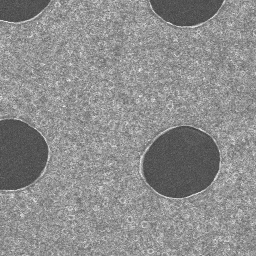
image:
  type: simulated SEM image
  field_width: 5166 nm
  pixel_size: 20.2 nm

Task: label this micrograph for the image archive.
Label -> holes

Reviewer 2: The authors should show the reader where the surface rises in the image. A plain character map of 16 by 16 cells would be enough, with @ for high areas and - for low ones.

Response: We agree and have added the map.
---@@@@@@@----@@
@@@@@@@@@@@-@@@@
@@@@@@@@@@@@@@@@
@@@@@@@@@@@@@@@@
@@@@@@@@@@@@@@@@
@@@@@@@@@@@@@@@@
@@@@@@@@@@@@@@@@
-@@@@@@@@@@@@@@@
---@@@@@@@---@@@
---@@@@@@-----@@
---@@@@@@-----@@
--@@@@@@@----@@@
@@@@@@@@@@@@@@@@
@@@@@@@@@@@@@@@@
@@@@@@@@@@@@@@@@
@@@@@@@@@@@@@@@@